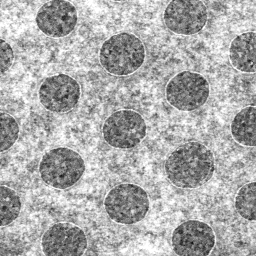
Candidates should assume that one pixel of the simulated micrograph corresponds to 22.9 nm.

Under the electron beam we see raised bodies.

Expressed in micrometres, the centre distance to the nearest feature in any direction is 1.69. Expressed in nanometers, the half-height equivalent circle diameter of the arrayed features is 1010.